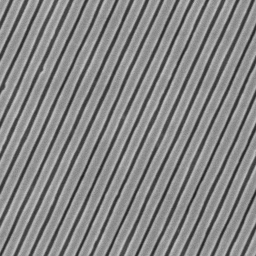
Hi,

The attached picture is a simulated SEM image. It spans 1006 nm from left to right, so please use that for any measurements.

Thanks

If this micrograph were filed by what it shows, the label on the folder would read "parallel lines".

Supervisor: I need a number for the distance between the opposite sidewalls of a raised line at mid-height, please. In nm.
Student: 39.4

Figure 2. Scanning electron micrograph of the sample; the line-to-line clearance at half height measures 14.3 nanometres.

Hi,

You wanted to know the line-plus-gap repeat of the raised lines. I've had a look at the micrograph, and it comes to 54 nanometers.